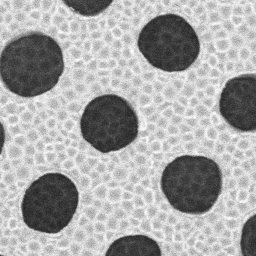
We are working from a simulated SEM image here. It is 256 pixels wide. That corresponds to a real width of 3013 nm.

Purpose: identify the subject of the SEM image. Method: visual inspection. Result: holes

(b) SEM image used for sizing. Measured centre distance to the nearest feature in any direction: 1170 nm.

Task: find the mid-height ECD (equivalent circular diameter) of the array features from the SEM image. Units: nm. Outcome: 694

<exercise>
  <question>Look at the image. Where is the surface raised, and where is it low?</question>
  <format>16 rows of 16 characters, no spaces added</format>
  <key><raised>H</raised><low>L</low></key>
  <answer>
HHHHLLLHHHHHHHHH
HHHHHHHHHLLLHHHH
HLLHHHHHHLLLHHHH
LLLLHHHHHLLLHHHH
LLLLHHHHHHHHHHHH
LLLHHHHHHHHHHHLL
HHHHHHLLHHHHHHLL
HHHHHLLLLHHHHHLL
HHHHHLLLLHHHHHHH
HHHHHHLHHHHHHHHH
HHHHHHHHHHLLLLHH
HHLLLHHHHHLLLLHH
HLLLLHHHHHLLLLHH
HLLLLHHHHHHHHHHH
HHHLHHHHHHHHHHHL
HHHHHHHLLLHHHHHL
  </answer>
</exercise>